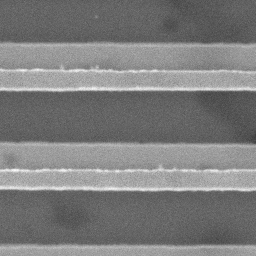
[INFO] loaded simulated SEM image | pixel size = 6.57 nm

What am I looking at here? lines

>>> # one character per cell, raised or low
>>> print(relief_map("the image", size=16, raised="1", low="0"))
0000000000000000
0000000000000000
0000000000000000
1111111111111111
1111111111111111
1111111111111111
0000000000000000
0000000000000000
0000000000000000
1111111111111111
1111111111111111
1111111111111111
0000000000000000
0000000000000000
0000000000000000
1111111111111111